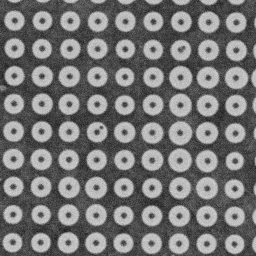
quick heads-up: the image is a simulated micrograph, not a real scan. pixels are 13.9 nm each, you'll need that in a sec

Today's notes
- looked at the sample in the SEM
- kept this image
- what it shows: an array of small figures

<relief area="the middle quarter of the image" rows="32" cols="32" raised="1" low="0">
00000000000000000000000000000000
11100001110000111000011100011110
11110011111001111000111110011111
11110011111001111000111110111111
11100011110001111000111110011111
11000000100000000000011100011110
00000000000000000000000000000000
00000000000000000000000000000000
11100001110000111000111100011110
11110011111001111000111110111111
11110011111001111000111110111111
11100011110001111000111100011111
01000000100000110000011000001110
00000000000000000000000000000000
11000000000000000000000000000000
11100011110001111000111100011110
11110011111001111100111110111111
11110011111001111100111110111111
11100011110001111000111100111111
00000000000000110000011100011110
00000000000000000000000000000000
00000000000000000000000000001100
11100011110001111000111100011110
11110011111001111100111110111111
11110011111001111100111110111111
11100011110001111000111100011111
00000000000000000000001000011100
00000000000000000000000000000000
11000001100000000000000000001100
11100011110001111000111100011110
11110111111001111000111100011110
11110111111001111000111100111110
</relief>